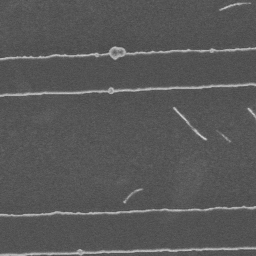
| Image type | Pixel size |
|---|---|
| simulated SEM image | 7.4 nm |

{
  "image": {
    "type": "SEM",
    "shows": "lines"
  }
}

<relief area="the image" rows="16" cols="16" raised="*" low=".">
................
................
................
...*************
****************
*************...
................
................
................
................
................
................
................
****************
****************
****************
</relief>